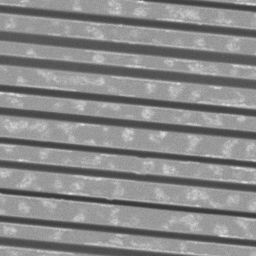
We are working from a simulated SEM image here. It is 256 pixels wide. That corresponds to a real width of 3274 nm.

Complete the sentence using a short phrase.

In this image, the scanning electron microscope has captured parallel lines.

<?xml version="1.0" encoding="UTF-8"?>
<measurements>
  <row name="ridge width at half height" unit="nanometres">205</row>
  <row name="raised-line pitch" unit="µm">0.33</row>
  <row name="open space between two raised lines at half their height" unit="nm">108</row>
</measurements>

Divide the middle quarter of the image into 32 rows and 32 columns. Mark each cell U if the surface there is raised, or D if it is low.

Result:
DDDDDDDDDDDDDDDUUUUUUUUUUUUUUUUU
DDDDDDDDDDDDDDDDDDDDDDDDDUUUUUUU
UUUUUDDDDDDDDDDDDDDDDDDDDDDDDDDD
UUUUUUUUUUUUUUUUUDDDDDDDDDDDDDDD
UUUUUUUUUUUUUUUUUUUUUUUUUDDDDDDD
UUUUUUUUUUUUUUUUUUUUUUUUUUUUUUUU
UUUUUUUUUUUUUUUUUUUUUUUUUUUUUUUU
DDDDDDDDDUUUUUUUUUUUUUUUUUUUUUUU
DDDDDDDDDDDDDDDDDDDUUUUUUUUUUUUU
UUUUUUUUDDDDDDDDDDDDDDDDDDDDDDUU
UUUUUUUUUUUUUUUUUUUDDDDDDDDDDDDD
UUUUUUUUUUUUUUUUUUUUUUUUUUUUUDDD
DDUUUUUUUUUUUUUUUUUUUUUUUUUUUUUU
DDDDDDDDDDDDDUUUUUUUUUUUUUUUUUUU
UDDDDDDDDDDDDDDDDDDDDDDUUUUUUUUU
UUUUUUUUUDUDDDDDDDDDDDDDDDDDDDDD
UUUUUUUUUUUUUUUUUUUUDDDDDDDDDDDD
UUUUUUUUUUUUUUUUUUUUUUUUUUUUUUDU
UUUUUUUUUUUUUUUUUUUUUUUUUUUUUUUU
UUUUUUUUUUUUUUUUUUUUUUUUUUUUUUUU
DDDDDDDDDUUUUUUUUUUUUUUUUUUUUUUU
UDDDDDDDDDDDDDDDDDDUUUUUUUUUUUUU
UUUUUUUUUUUDDDDDDDDDDDDDDDDDDDUU
UUUUUUUUUUUUUUUUUUUDDDDDDDDDDDDD
UUUUUUUUUUUUUUUUUUUUUUUUUUUUUUUD
DDUUUUUUUUUUUUUUUUUUUUUUUUUUUUUU
DDDDDDDDDDDDUUUUUUUUUUUUUUUUUUUU
DDDDDDDDDDDDDDDDDDDDDDDUUUUUUUUU
UUUUUUUUUDDDDDDDDDDDDDDDDDDDDDDD
UUUUUUUUUUUUUUUUUUUUDDDDDDDDDDDD
UUUUUUUUUUUUUUUUUUUUUUUUUUUUUUDD
UUUUUUUUUUUUUUUUUUUUUUUUUUUUUUUU